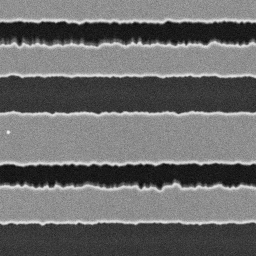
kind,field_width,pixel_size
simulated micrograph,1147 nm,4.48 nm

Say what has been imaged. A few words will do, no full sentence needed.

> lines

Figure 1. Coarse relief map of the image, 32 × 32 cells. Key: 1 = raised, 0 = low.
11111111111111111111111111111111
11111111111111111111111111111111
11111111111111111111111111111111
00000000000000000000000000000000
00000000000000000000000000000000
01001000000001101100000000110001
11111111111111111111111111111111
11111111111111111111111111111111
11111111111111111111111111111111
00100100110001010101110010011111
00000000000000000000000000000000
00000000000000000000000000000000
00000000000000000000000000000000
00000000000000000000000000000000
11111111111111111111111111111111
11111111111111111111111111111111
11111111111111111111111111111111
11111111111111111111111111111111
11111111111111111111111111111111
11111111111111111111111111111111
11111111111111111101001001001011
00000000000000000000000000000000
00000000000000000000000000000000
11111111111110111010111111111111
11111111111111111111111111111111
11111111111111111111111111111111
11111111111111111111111111111111
11111111111111111111111111111111
00000000000000000000000000000000
00000000000000000000000000000000
00000000000000000000000000000000
00000000000000000000000000000000